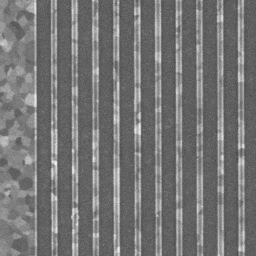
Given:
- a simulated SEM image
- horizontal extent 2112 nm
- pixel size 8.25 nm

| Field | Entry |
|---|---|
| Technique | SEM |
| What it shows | parallel lines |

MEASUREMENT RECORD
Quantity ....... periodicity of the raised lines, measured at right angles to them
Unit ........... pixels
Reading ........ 20.8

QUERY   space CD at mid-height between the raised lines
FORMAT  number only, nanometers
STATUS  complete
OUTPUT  136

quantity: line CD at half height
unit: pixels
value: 4.87